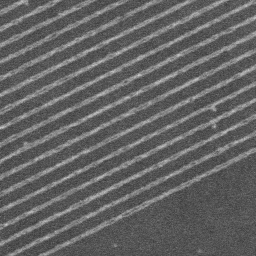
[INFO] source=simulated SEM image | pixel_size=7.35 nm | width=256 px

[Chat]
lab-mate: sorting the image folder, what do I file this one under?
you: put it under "parallel lines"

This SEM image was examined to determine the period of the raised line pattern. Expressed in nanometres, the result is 109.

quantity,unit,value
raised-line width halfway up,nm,18.9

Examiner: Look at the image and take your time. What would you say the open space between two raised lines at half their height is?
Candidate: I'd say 93.7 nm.